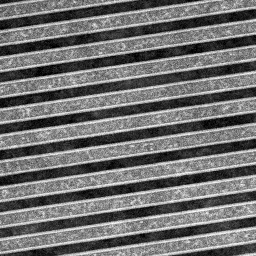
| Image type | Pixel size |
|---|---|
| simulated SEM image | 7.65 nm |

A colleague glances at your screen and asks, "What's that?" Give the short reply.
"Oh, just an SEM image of parallel lines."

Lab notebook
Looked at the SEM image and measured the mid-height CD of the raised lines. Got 106 nanometres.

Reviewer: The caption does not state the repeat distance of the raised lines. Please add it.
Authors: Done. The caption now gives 197 nm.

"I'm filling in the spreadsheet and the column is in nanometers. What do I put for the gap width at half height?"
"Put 91.7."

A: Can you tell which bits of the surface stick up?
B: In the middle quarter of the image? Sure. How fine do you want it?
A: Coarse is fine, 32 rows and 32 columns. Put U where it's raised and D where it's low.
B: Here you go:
DDDDDDDDDDDDDUDUUUUUUUUUUUUUUUUU
DDDDDDDDUUUUUUUUUUUUUUUUUUUUUDDD
DUUUUUUUUUUUUUUUUUUUUUUDDDDDDDDD
UUUUUUUUUUUUUUUUDDDDDDDDDDDDDDDD
UUUUUUUUUDDDDDDDDDDDDDDDDDDDDDDU
UUDDDDDDDDDDDDDDDDDDDDDDUUUUUUUU
DDDDDDDDDDDDDDDDDUUUUUUUUUUUUUUU
DDDDDDDDDDUUUUUUUUUUUUUUUUUUUUUU
DDDDUUUUUUUUUUUUUUUUUUUUUUDDDDDD
UUUUUUUUUUUUUUUUUUUDDDDDDDDDDDDD
UUUUUUUUUUUUUDDDDDDDDDDDDDDDDDDD
UUUUUUDDDDDDDDDDDDDDDDDDDDDDUUUU
DDDDDDDDDDDDDDDDDDDDDUUUUUUUUUUU
DDDDDDDDDDDDDDUUUUUUUUUUUUUUUUUU
DDDDDDDUUUUUUUUUUUUUUUUUUUUUUUDD
UUUUUUUUUUUUUUUUUUUUUUUDDDDDDDDD
UUUUUUUUUUUUUUUUDDDDDDDDDDDDDDDD
UUUUUUUUUUDDDDDDDDDDDDDDDDDDDDDU
UUUDDDDDDDDDDDDDDDDDDDDDUUUUUUUU
DDDDDDDDDDDDDDDDDDUUUUUUUUUUUUUU
DDDDDDDDDDDUUUUUUUUUUUUUUUUUUUUU
DDDDUUUUUUUUUUUUUUUUUUUUUUUDDDDD
UUUUUUUUUUUUUUUUUUDDDDDDDDDDDDDD
UUUUUUUUUUUUUDDDDDDDDDDDDDDDDDDD
UUUUUUDDDDDDDDDDDDDDDDDDDDDDUUUU
DDDDDDDDDDDDDDDDDDDDDUUUUUUUUUUU
DDDDDDDDDDDDDDUUUUUUUUUUUUUUUUUU
DDDDDDDDUUUUUUUUUUUUUUUUUUUUUUDD
DUUUUUUUUUUUUUUUUUUUUUUUDDDDDDDD
UUUUUUUUUUUUUUUUUDDDDDDDDDDDDDDD
UUUUUUUUUUDDDDDDDDDDDDDDDDDDDDDD
UUUDDDDDDDDDDDDDDDDDDDDDDUUUUUUU